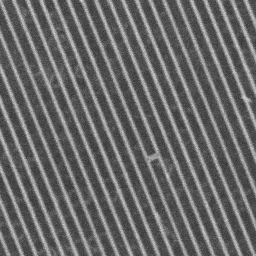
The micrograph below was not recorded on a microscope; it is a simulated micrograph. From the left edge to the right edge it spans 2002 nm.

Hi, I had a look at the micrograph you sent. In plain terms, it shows parallel lines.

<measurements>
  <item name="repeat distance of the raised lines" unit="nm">98.9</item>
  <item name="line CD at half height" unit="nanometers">19.1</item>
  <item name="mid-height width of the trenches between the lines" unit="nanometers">79.7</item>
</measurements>